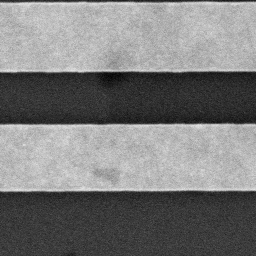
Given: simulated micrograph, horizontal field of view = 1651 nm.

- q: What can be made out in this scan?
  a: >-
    wiring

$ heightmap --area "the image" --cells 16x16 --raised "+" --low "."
++++++++++++++++
++++++++++++++++
++++++++++++++++
++++++++++++++++
................
................
................
................
++++++++++++++++
++++++++++++++++
++++++++++++++++
++++++++++++++++
................
................
................
................